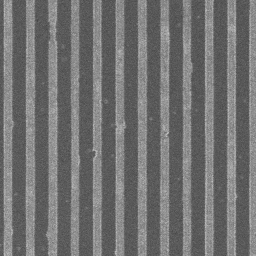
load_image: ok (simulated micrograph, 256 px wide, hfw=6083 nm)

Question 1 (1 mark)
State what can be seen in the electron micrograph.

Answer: parallel lines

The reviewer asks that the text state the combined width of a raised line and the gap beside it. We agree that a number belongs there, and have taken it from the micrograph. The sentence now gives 531 nm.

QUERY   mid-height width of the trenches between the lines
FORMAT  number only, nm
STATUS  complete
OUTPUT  350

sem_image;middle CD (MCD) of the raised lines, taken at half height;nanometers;184